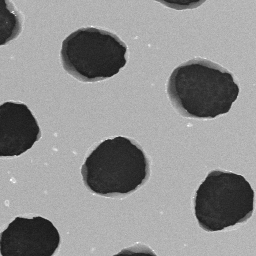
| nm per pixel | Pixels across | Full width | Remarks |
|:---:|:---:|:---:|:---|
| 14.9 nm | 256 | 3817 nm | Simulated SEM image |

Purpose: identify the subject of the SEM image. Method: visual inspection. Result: holes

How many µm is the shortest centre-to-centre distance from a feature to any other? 1.69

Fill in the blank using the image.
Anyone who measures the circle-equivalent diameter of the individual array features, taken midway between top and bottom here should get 0.881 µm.